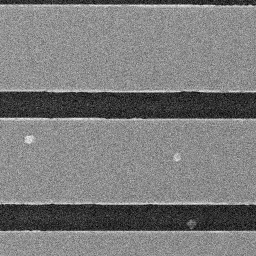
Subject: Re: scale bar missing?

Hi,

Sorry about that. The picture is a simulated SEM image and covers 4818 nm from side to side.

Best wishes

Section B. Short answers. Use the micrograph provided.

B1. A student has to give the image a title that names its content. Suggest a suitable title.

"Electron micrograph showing lines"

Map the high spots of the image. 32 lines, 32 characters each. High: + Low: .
................................
++++++++++++++++++++++++++++++++
++++++++++++++++++++++++++++++++
++++++++++++++++++++++++++++++++
++++++++++++++++++++++++++++++++
++++++++++++++++++++++++++++++++
++++++++++++++++++++++++++++++++
++++++++++++++++++++++++++++++++
++++++++++++++++++++++++++++++++
++++++++++++++++++++++++++++++++
++++++++++++++++++++++++++++++++
................................
................................
................................
................................
++++++++++++++++++++++++++++++++
++++++++++++++++++++++++++++++++
++++++++++++++++++++++++++++++++
++++++++++++++++++++++++++++++++
++++++++++++++++++++++++++++++++
++++++++++++++++++++++++++++++++
++++++++++++++++++++++++++++++++
++++++++++++++++++++++++++++++++
++++++++++++++++++++++++++++++++
++++++++++++++++++++++++++++++++
................................
................................
................................
................................
++++++++++++++++++++++++++++++++
++++++++++++++++++++++++++++++++
++++++++++++++++++++++++++++++++